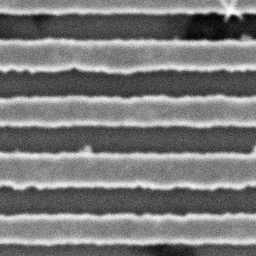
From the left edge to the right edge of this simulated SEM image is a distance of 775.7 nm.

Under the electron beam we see lines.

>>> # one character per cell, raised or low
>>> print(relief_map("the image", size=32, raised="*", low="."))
********************************
********************************
................................
................................
................................
********************************
********************************
********************************
********************************
................................
................................
................................
********************************
********************************
********************************
********************************
................................
................................
................................
********************************
********************************
********************************
********************************
..*................**...***..*..
................................
................................
................................
********************************
********************************
********************************
......*.........................
................................